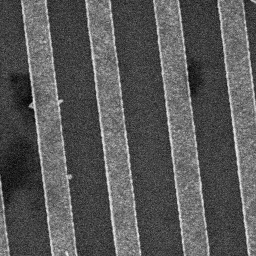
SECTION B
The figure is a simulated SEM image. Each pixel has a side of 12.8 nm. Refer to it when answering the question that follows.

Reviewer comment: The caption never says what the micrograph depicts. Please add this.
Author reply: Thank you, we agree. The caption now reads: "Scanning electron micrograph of lines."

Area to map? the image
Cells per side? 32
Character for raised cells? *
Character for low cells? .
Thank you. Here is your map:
...***.....***.....***.....***..
...***.....***.....***.....****.
...***.....***.....****.....***.
...***.....***......***.....***.
...***.....***......***.....***.
...***.....***......***.....***.
...***......***.....***.....***.
....***.....***.....***.....***.
....***.....***.....***.....***.
....***.....***.....***.....***.
....***.....***.....****....****
....***.....***......***.....***
....***.....***......***.....***
....***.....***......***.....***
....****....***......***.....***
.....***....****.....***.....***
.....***.....***.....***.....***
.....***.....***.....****....***
.....***.....***.....****....***
.....***.....***......***.....**
.....***.....***......***.....**
.....***.....***......***.....**
.....****....***......***.....**
......***.....***.....***.....**
......***.....***.....***.....**
......***.....***.....***.....**
......***.....***.....***.....**
*.....***.....***.....****.....*
*.....***.....***......***.....*
*.....***.....***......***.....*
*.....***.....***......***.....*
*.....****.....***.....***.....*